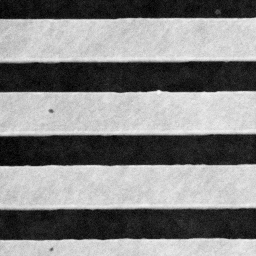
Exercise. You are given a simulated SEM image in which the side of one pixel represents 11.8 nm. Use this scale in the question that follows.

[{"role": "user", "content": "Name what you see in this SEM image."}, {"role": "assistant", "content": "lines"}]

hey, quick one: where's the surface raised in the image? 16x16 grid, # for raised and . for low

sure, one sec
................
################
################
################
................
................
################
################
................
................
################
################
################
................
................
################